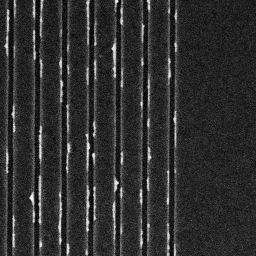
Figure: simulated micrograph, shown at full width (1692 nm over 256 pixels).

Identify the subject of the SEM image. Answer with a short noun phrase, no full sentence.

parallel lines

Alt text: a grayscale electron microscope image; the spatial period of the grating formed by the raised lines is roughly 178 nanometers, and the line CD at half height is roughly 0.141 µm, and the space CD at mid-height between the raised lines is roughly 5.51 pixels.